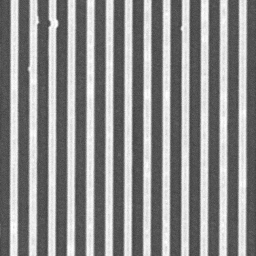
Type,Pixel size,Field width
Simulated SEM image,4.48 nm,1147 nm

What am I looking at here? parallel lines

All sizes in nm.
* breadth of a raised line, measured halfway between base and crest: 31.4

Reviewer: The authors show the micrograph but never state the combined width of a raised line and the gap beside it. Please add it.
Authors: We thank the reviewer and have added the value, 19 px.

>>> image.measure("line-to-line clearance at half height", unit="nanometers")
54.9